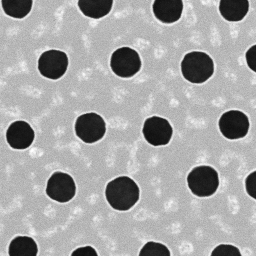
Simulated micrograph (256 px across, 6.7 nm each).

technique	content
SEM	a regular array of holes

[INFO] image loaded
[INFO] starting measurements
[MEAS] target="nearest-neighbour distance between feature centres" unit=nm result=445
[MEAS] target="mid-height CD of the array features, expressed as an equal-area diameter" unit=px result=30.4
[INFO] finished